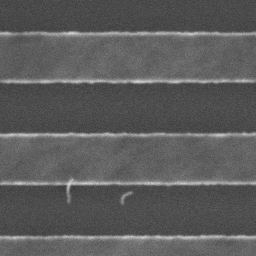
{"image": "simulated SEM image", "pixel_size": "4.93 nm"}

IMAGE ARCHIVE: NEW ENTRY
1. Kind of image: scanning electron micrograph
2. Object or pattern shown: lines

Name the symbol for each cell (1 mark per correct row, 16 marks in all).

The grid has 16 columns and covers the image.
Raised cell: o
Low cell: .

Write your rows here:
................
................
oooooooooooooooo
oooooooooooooooo
oooooooooooooooo
................
................
................
oooooooooooooooo
oooooooooooooooo
oooooooooooooooo
oooooooooooooooo
................
................
................
oooooooooooooooo